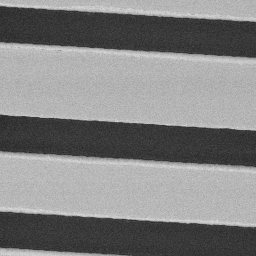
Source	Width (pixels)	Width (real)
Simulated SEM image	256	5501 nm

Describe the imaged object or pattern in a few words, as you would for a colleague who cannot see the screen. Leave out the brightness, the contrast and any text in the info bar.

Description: lines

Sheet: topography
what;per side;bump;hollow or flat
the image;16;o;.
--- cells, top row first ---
..oooooooooooooo
................
................
ooooooooooooo...
oooooooooooooooo
oooooooooooooooo
oooooooooooooooo
......oooooooooo
................
................
oooooooooooooooo
oooooooooooooooo
oooooooooooooooo
.....ooooooooooo
................
................